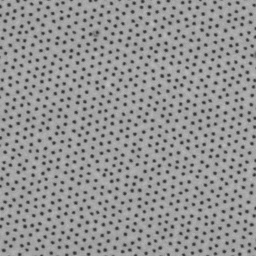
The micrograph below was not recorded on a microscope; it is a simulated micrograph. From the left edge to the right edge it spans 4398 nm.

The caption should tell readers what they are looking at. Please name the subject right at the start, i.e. a regular array of holes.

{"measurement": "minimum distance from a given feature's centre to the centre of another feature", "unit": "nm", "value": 130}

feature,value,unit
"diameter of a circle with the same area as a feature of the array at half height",61.3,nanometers